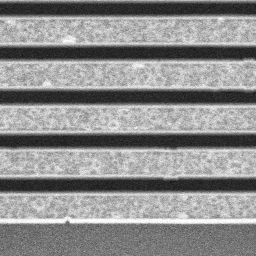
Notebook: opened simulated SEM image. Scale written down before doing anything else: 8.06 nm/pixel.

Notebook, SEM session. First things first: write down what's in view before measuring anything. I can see parallel lines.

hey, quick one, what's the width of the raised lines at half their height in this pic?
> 235 nanometers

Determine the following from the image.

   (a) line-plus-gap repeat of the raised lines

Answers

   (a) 0.353 µm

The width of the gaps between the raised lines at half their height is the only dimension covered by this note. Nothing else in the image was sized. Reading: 118 nm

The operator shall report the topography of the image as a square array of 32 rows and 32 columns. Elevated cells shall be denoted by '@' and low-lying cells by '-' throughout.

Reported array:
--------------------------------
--------------------------------
@@@@@@@@@@@@@@@@@@@@@@@@@@@@@@@@
@@@@@@@@@@@@@@@@@@@@@@@@@@@@@@@@
@@@@@@@@@@@@@@@@@@@@@@@@@@@@@@@@
@@@@@@@@@@@@@@@@@@@@@@@@@@@@@@@@
--------------------------------
------------------------------@@
@@@@@@@@@@@@@@@@@@@@@@@@@@@@@@@@
@@@@@@@@@@@@@@@@@@@@@@@@@@@@@@@@
@@@@@@@@@@@@@@@@@@@@@@@@@@@@@@@@
--------------------------------
--------------------------------
@@@@@@@@@@@@@@@@@@@@@@@@@@@@@@@@
@@@@@@@@@@@@@@@@@@@@@@@@@@@@@@@@
@@@@@@@@@@@@@@@@@@@@@@@@@@@@@@@@
@@@@@@@@@@@@@@@@@@@@@@@@@@@@@@@@
--------------------------------
--------------------------------
@@@@@@@@@@@@@@@@@@@@@@@@@@@@@@@@
@@@@@@@@@@@@@@@@@@@@@@@@@@@@@@@@
@@@@@@@@@@@@@@@@@@@@@@@@@@@@@@@@
--------------------------------
--------------------------------
@@@@@@@@@@@@@@@@@@@@@@@@@@@@@@@@
@@@@@@@@@@@@@@@@@@@@@@@@@@@@@@@@
@@@@@@@@@@@@@@@@@@@@@@@@@@@@@@@@
@@@@@@@@-@@@@@@@@@@@@@@@@@@@@@@@
--------------------------------
--------------------------------
--------------------------------
--------------------------------